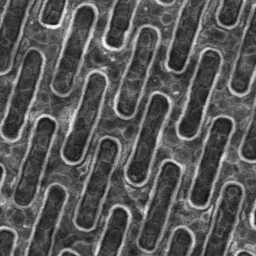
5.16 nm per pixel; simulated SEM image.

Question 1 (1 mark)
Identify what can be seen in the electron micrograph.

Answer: a regular array of holes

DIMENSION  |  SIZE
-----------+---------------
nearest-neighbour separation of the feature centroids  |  342 nm